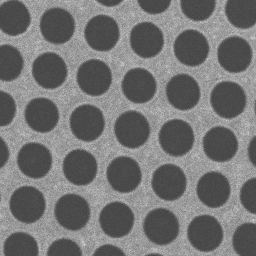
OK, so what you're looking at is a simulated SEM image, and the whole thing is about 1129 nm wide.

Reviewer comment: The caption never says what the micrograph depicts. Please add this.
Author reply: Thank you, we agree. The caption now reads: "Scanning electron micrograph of a regular array of holes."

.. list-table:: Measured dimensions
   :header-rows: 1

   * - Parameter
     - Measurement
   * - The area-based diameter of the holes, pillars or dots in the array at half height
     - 0.159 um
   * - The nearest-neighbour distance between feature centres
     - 197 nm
